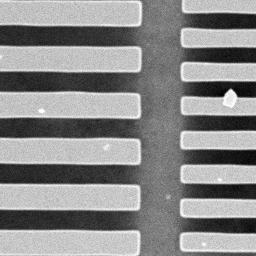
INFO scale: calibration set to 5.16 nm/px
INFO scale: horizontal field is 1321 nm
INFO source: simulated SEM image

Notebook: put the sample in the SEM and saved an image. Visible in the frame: groups of lines, slits or small figures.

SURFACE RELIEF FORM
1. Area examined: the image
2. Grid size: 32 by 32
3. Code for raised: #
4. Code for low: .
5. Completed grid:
##################.....#########
##################.....#########
##################..............
................................
.......................#########
.......................#########
##################..............
##################..............
##################.....#########
.......................#########
................................
.......####.................#...
#################......#########
#################......#########
#################...............
................................
.......................#########
#################......#########
#################......#########
#################...............
..........####.##...............
.......................#########
.......................#########
#################...............
#################...............
#################......#########
.......................#########
................................
................................
#################......#########
#################......#########
#################...............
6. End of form